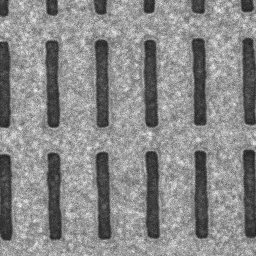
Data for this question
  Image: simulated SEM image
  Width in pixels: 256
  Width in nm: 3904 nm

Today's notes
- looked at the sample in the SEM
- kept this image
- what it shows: a regular array of holes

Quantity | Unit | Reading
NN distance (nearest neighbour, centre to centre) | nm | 743